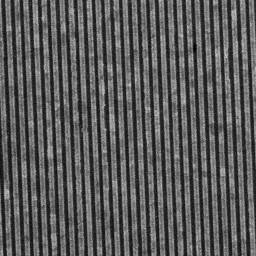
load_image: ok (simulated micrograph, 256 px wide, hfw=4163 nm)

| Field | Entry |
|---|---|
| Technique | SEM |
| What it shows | parallel lines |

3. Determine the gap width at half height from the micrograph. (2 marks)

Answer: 83.2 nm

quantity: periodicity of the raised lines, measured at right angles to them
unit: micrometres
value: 0.147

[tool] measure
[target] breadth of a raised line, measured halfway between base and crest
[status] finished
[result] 0.069 µm